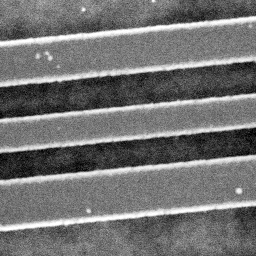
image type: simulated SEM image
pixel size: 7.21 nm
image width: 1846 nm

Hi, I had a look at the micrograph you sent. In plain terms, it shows lines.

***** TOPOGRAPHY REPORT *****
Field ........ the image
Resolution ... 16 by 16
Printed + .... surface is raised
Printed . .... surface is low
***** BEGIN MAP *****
................
............++++
..++++++++++++++
++++++++++++++++
+++++++++.......
................
..........++++++
++++++++++++++++
++++++++++......
................
........++++++++
++++++++++++++++
++++++++++++++++
+++++++++.......
................
................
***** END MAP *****